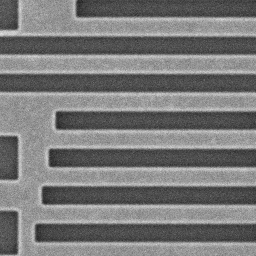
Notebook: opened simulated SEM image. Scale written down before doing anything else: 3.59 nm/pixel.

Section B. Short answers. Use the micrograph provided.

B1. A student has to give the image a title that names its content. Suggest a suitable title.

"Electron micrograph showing groups of lines, slits or small figures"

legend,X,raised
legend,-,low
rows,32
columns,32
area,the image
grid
--XXXXXXX-----------------------
--XXXXXXX-----------------------
--XXXXXXXXXXXXXXXXXXXXXXXXXXXXXX
--XXXXXXXXXXXXXXXXXXXXXXXXXXXXXX
--------------------------------
--------------------------------
--------------------------------
XXXXXXXXXXXXXXXXXXXXXXXXXXXXXXXX
XXXXXXXXXXXXXXXXXXXXXXXXXXXXXXXX
--------------------------------
--------------------------------
--------------------------------
XXXXXXXXXXXXXXXXXXXXXXXXXXXXXXXX
XXXXXXXXXXXXXXXXXXXXXXXXXXXXXXXX
XXXXXXX-------------------------
XXXXXXX-------------------------
XXXXXXXXXXXXXXXXXXXXXXXXXXXXXXXX
--XXXXXXXXXXXXXXXXXXXXXXXXXXXXXX
--XXXXX-------------------------
--XXXX--------------------------
--XXXX--------------------------
--XXXXXXXXXXXXXXXXXXXXXXXXXXXXXX
--XXXXXXXXXXXXXXXXXXXXXXXXXXXXXX
XXXXX---------------------------
XXXXX---------------------------
XXXXX---------------------------
--XXXXXXXXXXXXXXXXXXXXXXXXXXXXXX
--XXXXXXXXXXXXXXXXXXXXXXXXXXXXXX
--XX----------------------------
--XX----------------------------
--XXXXXXXXXXXXXXXXXXXXXXXXXXXXXX
--XXXXXXXXXXXXXXXXXXXXXXXXXXXXXX